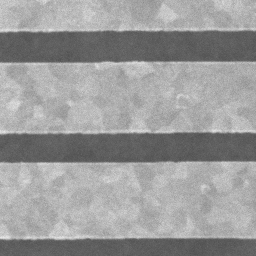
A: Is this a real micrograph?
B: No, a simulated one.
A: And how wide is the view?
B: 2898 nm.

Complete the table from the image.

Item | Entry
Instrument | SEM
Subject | lines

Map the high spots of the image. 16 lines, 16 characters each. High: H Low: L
HHHHHHHHHHHHHHHH
HHHHHHHHHHHHHHHH
LLLLLLLLLLLLLLLL
LLLLLLLLLLLLLLLL
HHHHHHHHHHHHHHHH
HHHHHHHHHHHHHHHH
HHHHHHHHHHHHHHHH
HHHHHHHHHHHHHHHH
LLLLLLLLLLLLLLLL
LLLLLLLLLLLLLLLL
HHHHHHHHHHHHHHHH
HHHHHHHHHHHHHHHH
HHHHHHHHHHHHHHHH
HHHHHHHHHHHHHHHH
HHHHHHHHHHHHHHHH
LLLLLLLLLLLLLLLL